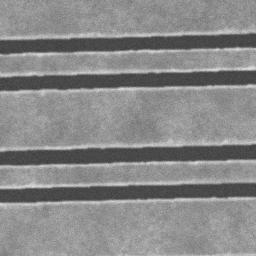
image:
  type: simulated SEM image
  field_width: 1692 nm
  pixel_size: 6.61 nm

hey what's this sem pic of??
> lines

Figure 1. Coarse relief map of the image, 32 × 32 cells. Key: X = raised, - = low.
XXXXXXXXXXXXXXXXXXXXXXXXXXXXXXXX
XXXXXXXXXXXXXXXXXXXXXXXXXXXXXXXX
XXXXXXXXXXXXXXXXXXXXXXXXXXXXXXXX
XXXXXXXXXXXXXXXXXXXXXXXXXXXXXXXX
XXXXXXXXXX----------------------
--------------------------------
---------------XXXXXXXXXXXXXXXXX
XXXXXXXXXXXXXXXXXXXXXXXXXXXXXXXX
XXXXXXXXXXXXXXXXXXXXXXXXXXXXXXXX
--------------------------------
--------------------------------
X-XXXXXXXXXXXXXXXXXXXXXXXXXXXXXX
XXXXXXXXXXXXXXXXXXXXXXXXXXXXXXXX
XXXXXXXXXXXXXXXXXXXXXXXXXXXXXXXX
XXXXXXXXXXXXXXXXXXXXXXXXXXXXXXXX
XXXXXXXXXXXXXXXXXXXXXXXXXXXXXXXX
XXXXXXXXXXXXXXXXXXXXXXXXXXXXXXXX
XXXXXXXXXXXXXXXXXXXXXXXXXXXXXXXX
XXXXXXXXX-----------------------
--------------------------------
--------------XXXXXXXXXXXXXXXXXX
XXXXXXXXXXXXXXXXXXXXXXXXXXXXXXXX
XXXXXXXXXXXXXXXXXXXXXXXXXXXX----
--------------------------------
--------------------------------
----XXXXXXXXXXXXXXXXXXXXXXXXXXXX
XXXXXXXXXXXXXXXXXXXXXXXXXXXXXXXX
XXXXXXXXXXXXXXXXXXXXXXXXXXXXXXXX
XXXXXXXXXXXXXXXXXXXXXXXXXXXXXXXX
XXXXXXXXXXXXXXXXXXXXXXXXXXXXXXXX
XXXXXXXXXXXXXXXXXXXXXXXXXXXXXXXX
XXXXXXXXXXXXXXXXXXXXXXXXXXXXXXXX